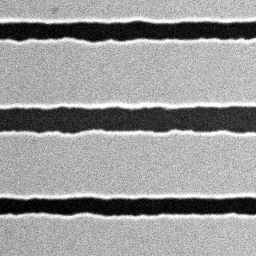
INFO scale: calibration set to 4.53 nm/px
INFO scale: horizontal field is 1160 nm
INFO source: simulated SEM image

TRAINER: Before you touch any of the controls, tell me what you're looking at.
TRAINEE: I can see lines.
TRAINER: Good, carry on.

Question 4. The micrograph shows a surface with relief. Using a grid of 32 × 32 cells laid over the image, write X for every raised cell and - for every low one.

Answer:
XXXXXXXXXXXXXXXXXXXXXXXXXXXXXXXX
XXXXXXXXXXXXXXXXXXXXXXXXXXXXXXXX
XXXXXXXXXXXXXXXXXXXXXXXXXXXXXXXX
--------------------------------
--------------------------------
XXXXXXXXXXXXXXXXXXXXXXXXXXXXXXXX
XXXXXXXXXXXXXXXXXXXXXXXXXXXXXXXX
XXXXXXXXXXXXXXXXXXXXXXXXXXXXXXXX
XXXXXXXXXXXXXXXXXXXXXXXXXXXXXXXX
XXXXXXXXXXXXXXXXXXXXXXXXXXXXXXXX
XXXXXXXXXXXXXXXXXXXXXXXXXXXXXXXX
XXXXXXXXXXXXXXXXXXXXXXXXXXXXXXXX
XXXXXXXXXXXXXXXXXXXXXXXXXXXXXXXX
X----XX---XXX--XXX---XX---------
--------------------------------
--------------------------------
-----------XX----X---XXX---X----
XXXXXXXXXXXXXXXXXXXXXXXXXXXXXXXX
XXXXXXXXXXXXXXXXXXXXXXXXXXXXXXXX
XXXXXXXXXXXXXXXXXXXXXXXXXXXXXXXX
XXXXXXXXXXXXXXXXXXXXXXXXXXXXXXXX
XXXXXXXXXXXXXXXXXXXXXXXXXXXXXXXX
XXXXXXXXXXXXXXXXXXXXXXXXXXXXXXXX
XXXXXXXXXXXXXXXXXXXXXXXXXXXXXXXX
XXXXXXXXXXXXXXXXXXXXXXXXXXXXXXXX
--------------------------------
--------------------------------
XXXXXXXXXXXXXXXXXXXXXXXXXXXXXXXX
XXXXXXXXXXXXXXXXXXXXXXXXXXXXXXXX
XXXXXXXXXXXXXXXXXXXXXXXXXXXXXXXX
XXXXXXXXXXXXXXXXXXXXXXXXXXXXXXXX
XXXXXXXXXXXXXXXXXXXXXXXXXXXXXXXX